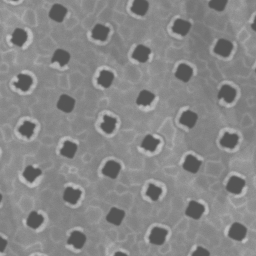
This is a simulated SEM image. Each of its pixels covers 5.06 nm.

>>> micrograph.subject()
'a regular array of holes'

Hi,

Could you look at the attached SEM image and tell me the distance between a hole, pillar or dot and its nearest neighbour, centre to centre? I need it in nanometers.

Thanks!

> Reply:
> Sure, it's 227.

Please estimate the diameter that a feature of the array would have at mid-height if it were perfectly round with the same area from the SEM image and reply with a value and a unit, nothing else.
0.0856 µm